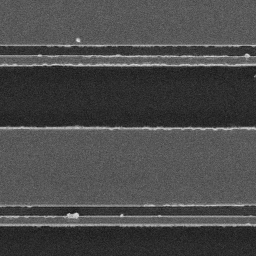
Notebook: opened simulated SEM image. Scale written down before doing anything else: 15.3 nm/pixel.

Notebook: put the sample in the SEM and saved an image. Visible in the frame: lines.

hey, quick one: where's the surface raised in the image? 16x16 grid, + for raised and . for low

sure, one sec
++++++++++++++++
++++++++++++++++
++++++++++++++++
++++++++++++++++
................
................
................
................
++++++++++++++++
++++++++++++++++
++++++++++++++++
++++++++++++++++
++++++++++++++++
++++++++++++++++
................
................